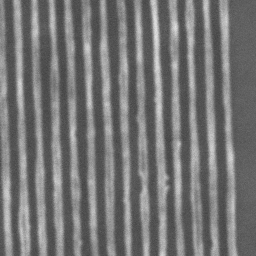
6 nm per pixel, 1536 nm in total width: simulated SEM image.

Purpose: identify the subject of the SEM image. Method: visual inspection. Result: parallel lines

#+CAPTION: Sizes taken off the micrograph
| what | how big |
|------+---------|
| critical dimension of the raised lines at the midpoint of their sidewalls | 0.03 um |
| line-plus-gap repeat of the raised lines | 103 nanometers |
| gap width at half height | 71.2 nm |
